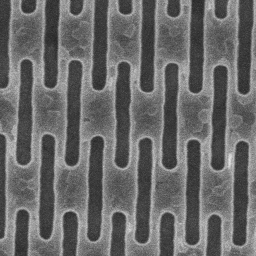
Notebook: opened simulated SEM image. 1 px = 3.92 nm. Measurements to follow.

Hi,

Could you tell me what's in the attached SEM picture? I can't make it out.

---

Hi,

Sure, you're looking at a regular array of holes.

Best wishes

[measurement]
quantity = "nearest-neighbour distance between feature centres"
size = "48.5 pixels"